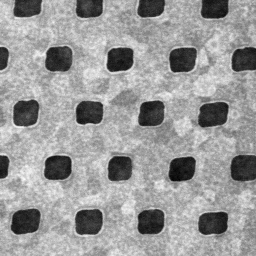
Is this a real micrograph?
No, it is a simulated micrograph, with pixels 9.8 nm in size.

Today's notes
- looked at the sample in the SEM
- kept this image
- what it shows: a regular array of holes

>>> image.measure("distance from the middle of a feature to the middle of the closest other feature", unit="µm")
0.605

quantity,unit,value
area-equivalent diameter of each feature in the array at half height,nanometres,278